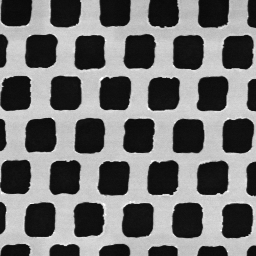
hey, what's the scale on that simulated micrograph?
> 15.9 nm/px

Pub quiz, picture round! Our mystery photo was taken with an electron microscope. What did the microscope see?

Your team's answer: a regular array of holes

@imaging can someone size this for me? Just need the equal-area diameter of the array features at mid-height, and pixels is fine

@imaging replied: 35.1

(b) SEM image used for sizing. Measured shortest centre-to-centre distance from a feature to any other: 767 nm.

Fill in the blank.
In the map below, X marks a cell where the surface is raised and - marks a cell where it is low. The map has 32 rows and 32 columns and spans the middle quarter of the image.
XXX-------XXXXX-------XXXXXX----
XXXX--XXXXXXXXXXXXXXXXXXXXXXXXXX
XXXXXXXXXXXXXXXXXXXXXXXXXXXXXXXX
----XXXXXX------XXXXXXX---X-XXXX
----XXXXX--------XXXX--------XXX
----XXXXX--------XXXX--------XXX
----XXXXX--------XXXX--------XXX
----XXXXX-------XXXXX--------XXX
-----XXXX-------XXXXX--------XXX
----XXXXX-------XXXXX--------XXX
----XXXXX-------XXXXX-------XXXX
---XXXXXXX-XX--XXXXXXX-----XXXXX
XXXXXXXXXXXXXXXXXXXXXXXXXXXXXXXX
XXXXXX---XXXXXXX-XX--XXXXXXXXXXX
XXX-------XXXXX-------XXXXXX----
XXX-------XXXXX--------XXXXX----
XXX-------XXXXX--------XXXX-----
XXX-------XXXXX-------XXXXX-----
XXX-------XXXXX-------XXXXX-----
XXX-------XXXXX-------XXXXX-----
XX--------XXXXX-------XXXXX-----
XXX------XXXXXX-------XXXXX-----
XXXXXXXXXXXXXXXXXXXXXXXXXXXXXXXX
XXXXXXXXXXXXXXXXXXXXXXXXXXXXXXXX
---XXXXXXX------XXXXXX------XXXX
----XXXXX-------XXXXX--------XXX
----XXXXX--------XXXX--------XXX
----XXXXX-------XXXXX-------XXXX
----XXXXX-------XXXXX-------XXXX
----XXXXX-------XXXXX-------XXXX
----XXXX--------XXXXX-------XXXX
----XXXXX-------XXXXX-------XXXX